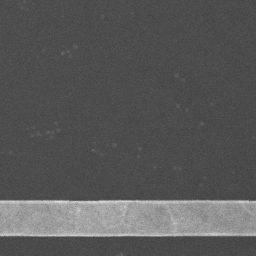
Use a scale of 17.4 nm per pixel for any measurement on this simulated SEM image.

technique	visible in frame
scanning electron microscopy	wiring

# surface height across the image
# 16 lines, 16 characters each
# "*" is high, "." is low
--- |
................
................
................
................
................
................
................
................
................
................
................
................
................
****************
****************
................